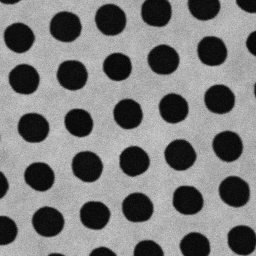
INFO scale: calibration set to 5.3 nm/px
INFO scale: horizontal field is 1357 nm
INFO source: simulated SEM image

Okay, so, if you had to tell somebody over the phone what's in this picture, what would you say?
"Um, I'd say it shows a regular array of holes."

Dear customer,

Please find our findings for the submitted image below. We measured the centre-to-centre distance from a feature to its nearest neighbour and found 0.243 um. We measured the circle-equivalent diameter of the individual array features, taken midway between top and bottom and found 0.16 microns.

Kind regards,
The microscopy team